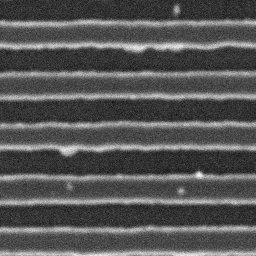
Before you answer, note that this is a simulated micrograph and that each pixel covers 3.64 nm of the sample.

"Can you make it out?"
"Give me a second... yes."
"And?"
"lines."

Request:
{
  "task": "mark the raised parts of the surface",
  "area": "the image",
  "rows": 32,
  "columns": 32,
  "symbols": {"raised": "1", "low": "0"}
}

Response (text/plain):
00000000000000000000000000000000
00000000000000000000000000000000
00000000000000000000000000000000
11111111111111111111111111111111
11111111111111111111111111111111
11111111111111111111111111111111
00000000000000000000000000000000
00000000000000000000000000000000
00000000000000000000000000000000
11111111111111111111111111111111
11111111111111111111111111111111
11111111111111111111111111111111
00000000000000000000000000000000
00000000000000000000000000000000
00000000000000000000000000000000
00000111000011111111111111111111
11111111111111111111111111111111
11111111111111111111111111111111
11111111111111111111111111111111
00000000000000000000000000000000
00000000000000000000000000000000
00000000000000000000000000000000
11111111111111111111111111111111
11111111111111111111111111111111
11111111111111111111111111111111
00000000000000000000000000000000
00000000000000000000000000000000
00000000000000000000000000000000
00000000000000000011000101011111
11111111111111111111111111111111
11111111111111111111111111111111
11111111111111111111111111111111